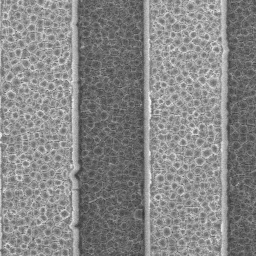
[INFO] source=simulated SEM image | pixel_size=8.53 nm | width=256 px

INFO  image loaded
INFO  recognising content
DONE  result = one or a few lines or trenches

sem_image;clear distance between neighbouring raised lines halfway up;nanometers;606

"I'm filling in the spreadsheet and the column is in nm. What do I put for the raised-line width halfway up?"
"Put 669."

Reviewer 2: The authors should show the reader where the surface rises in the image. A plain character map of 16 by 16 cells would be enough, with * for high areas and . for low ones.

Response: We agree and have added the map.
*****....*****..
*****....*****..
*****....*****..
*****....*****..
*****....*****..
*****....*****..
*****....*****..
*****....*****..
*****....*****..
*****....*****..
*****....*****..
*****....*****..
*****....*****..
*****....*****..
*****....*****..
*****....*****..